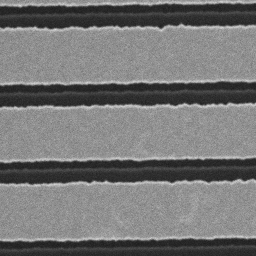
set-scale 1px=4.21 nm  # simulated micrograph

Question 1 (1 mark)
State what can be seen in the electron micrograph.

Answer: lines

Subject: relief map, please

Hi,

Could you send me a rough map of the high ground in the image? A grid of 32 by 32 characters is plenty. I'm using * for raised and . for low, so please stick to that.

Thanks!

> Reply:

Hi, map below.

********************..****......
................................
................................
..*......*.*********************
********************************
********************************
********************************
********************************
********************************
********************************
**.***..*.......................
................................
................................
********************************
********************************
********************************
********************************
********************************
********************************
********************************
................................
................................
...............................*
********************************
********************************
********************************
********************************
********************************
********************************
********************************
................................
................................